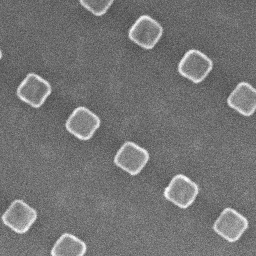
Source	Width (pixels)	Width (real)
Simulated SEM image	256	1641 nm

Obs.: a regular array of raised bodies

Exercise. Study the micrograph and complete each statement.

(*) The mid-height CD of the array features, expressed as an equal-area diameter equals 0.193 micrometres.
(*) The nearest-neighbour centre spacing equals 383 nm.